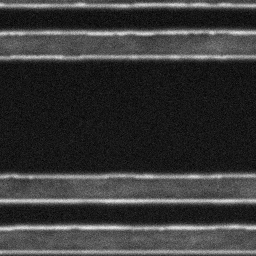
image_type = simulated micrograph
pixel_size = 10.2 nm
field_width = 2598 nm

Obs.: lines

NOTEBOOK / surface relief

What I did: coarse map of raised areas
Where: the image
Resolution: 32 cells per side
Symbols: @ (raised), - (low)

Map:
--------------------------------
@@@@@@@@@@@@@@@@@@@@@@@@@@@@@@@@
@@@@@@@@@@@@@@@@@@@@@@@@@@@@@@@@
@@@@@@@@@@@@@@@@@@@@@@@@@@@@@@@@
--------------------------------
--------------------------------
--------------------------------
@@@@@@@@@@@@@@@@@@@@@@@@@@@@@@@@
@@@@@@@@@@@@@@@@@@@@@@@@@@@@@@@@
@@@@@@@@@@@@@@@@@@@@@@@@@@@@@@@@
@@@@@@@@@@@@@@@@@@@@@@@@@@@@@@@@
@@@@@@@@@@@@@@@@@@@@@@@@@@@@@@@@
@@@@@@@@@@@@@@@@@@@@@@@@@@@@@@@@
@@@@@@@@@@@@@@@@@@@@@@@@@@@@@@@@
@@@@@@@@@@@@@@@@@@@@@@@@@@@@@@@@
@@@@@@@@@@@@@@@@@@@@@@@@@@@@@@@@
@@@@@@@@@@@@@@@@@@@@@@@@@@@@@@@@
@@@@@@@@@@@@@@@@@@@@@@@@@@@@@@@@
@@@@@@@@@@@@@@@@@@@@@@@@@@@@@@@@
@@@@@@@@@@@@@@@@@@@@@@@@@@@@@@@@
@@@@@@@@@@@@@@@@@@@@@@@@@@@@@@@@
@@@@@@@@@@@@@@@@@@@@@@@@@@@@@@@@
--------------------------------
--------------------------------
--------------------------------
@@@@@@@@@@@@@@@@@@@@@@@@@@@@@@@@
@@@@@@@@@@@@@@@@@@@@@@@@@@@@@@@@
@@@@@@@@@@@@@@@@@@@@@@@@@@@@@@@@
@@@@@@@@--@@@@@@@@@@@@@@@@@----@
--------------------------------
--------------------------------
@@@@@@@@@@@@@@@@@@@@@@@@@@@@@@@@